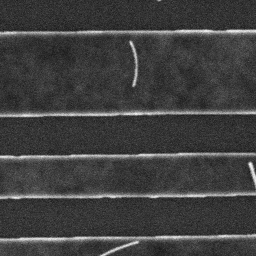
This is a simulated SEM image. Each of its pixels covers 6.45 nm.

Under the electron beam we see lines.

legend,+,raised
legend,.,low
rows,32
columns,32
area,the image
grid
................................
................................
................................
................................
++++++++++++++++++++++++++++++++
++++++++++++++++++++++++++++++++
++++++++++++++++++++++++++++++++
++++++++++++++++++++++++++++++++
++++++++++++++++++++++++++++++++
++++++++++++++++++++++++++++++++
++++++++++++++++++++++++++++++++
++++++++++++++++++++++++++++++++
++++++++++++++++++++++++++++++++
++++++++++++++++++++++++++++++++
+++++...........................
................................
................................
................................
................................
........++++++++++++++++++++++++
++++++++++++++++++++++++++++++++
++++++++++++++++++++++++++++++++
++++++++++++++++++++++++++++++++
++++++++++++++++++++++++++++++++
++++++++++++++++++++++++++......
................................
................................
................................
................................
...........................+++++
++++++++++++++++++++++++++++++++
++++++++++++++++++++++++++++++++